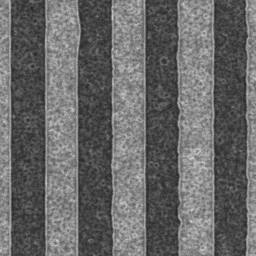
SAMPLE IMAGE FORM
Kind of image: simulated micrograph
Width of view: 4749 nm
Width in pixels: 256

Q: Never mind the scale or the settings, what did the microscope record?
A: one or a few lines or trenches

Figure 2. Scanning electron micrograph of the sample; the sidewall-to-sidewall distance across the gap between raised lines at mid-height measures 645 nm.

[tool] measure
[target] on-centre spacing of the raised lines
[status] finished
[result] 67.2 pixels